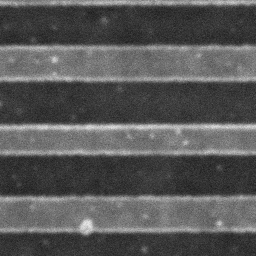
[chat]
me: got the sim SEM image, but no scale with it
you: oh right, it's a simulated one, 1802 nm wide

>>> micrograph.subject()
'lines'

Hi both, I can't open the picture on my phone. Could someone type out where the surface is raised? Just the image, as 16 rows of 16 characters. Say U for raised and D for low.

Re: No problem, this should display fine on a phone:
DDDDDDDDDDDDDDDD
DDDDDDDDDDDDDDDD
DDDDDDDDDDDDDDDD
UUUUUUUUUUUUUUUU
UUUUUUUUUUUUUUUU
DDDDDDDDDDDDDDDD
DDDDDDDDDDDDDDDD
DDDDDDDDDDDDDDDD
UUUUUUUUUUUUUUUU
UUUUUUUUUUUUUUUU
DDDDDDDDDDDDDDDD
DDDDDDDDDDDDDDDD
UUUUUUUUUUUUUUUU
UUUUUUUUUUUUUUUU
DDDDDUDDDDDDDDDD
DDDDDDDDDDDDDDDD